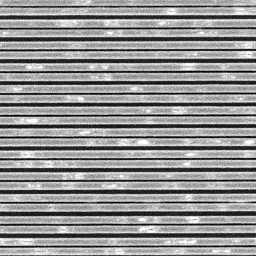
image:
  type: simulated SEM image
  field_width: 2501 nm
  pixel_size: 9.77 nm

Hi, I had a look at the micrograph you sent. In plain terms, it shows parallel lines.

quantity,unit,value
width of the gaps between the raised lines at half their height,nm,37.9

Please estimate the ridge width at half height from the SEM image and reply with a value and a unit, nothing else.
7.87 px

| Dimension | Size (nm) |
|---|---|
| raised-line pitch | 106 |